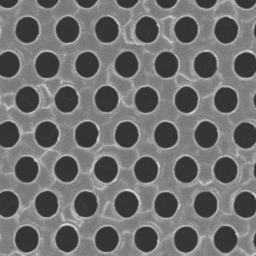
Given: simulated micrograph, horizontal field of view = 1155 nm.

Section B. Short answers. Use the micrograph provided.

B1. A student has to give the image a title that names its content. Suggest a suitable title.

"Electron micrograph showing a regular array of holes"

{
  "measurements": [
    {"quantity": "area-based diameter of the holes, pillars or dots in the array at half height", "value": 111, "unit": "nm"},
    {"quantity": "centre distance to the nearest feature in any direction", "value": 39.6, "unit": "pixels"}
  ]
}